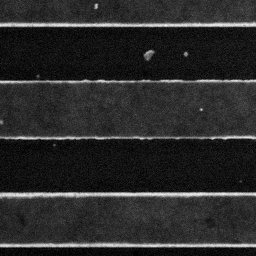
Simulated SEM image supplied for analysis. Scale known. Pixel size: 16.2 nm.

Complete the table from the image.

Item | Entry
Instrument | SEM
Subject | lines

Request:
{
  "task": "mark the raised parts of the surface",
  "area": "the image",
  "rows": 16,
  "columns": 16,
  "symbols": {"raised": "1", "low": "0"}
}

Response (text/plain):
1111111111111111
1111111111111111
0000000000000000
0000000000000000
0000000000000000
1111111111111111
1111111111111111
1111111111111111
1111111111111111
0000000000000000
0000000000000000
0000000000000000
1111111111111111
1111111111111111
1111111111111111
0000000000000000